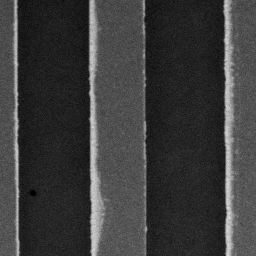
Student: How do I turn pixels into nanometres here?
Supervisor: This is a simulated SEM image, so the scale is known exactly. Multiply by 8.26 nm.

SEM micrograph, lines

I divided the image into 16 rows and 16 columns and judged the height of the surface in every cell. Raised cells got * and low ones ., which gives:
*.....***.....**
*.....***.....**
*.....***.....**
*.....***.....**
*.....***.....**
*.....***.....**
*.....***.....**
*.....***.....**
*.....***.....**
*.....***.....**
*.....***.....**
*.....***.....**
*.....***.....**
*.....***.....**
*.....***.....**
*.....***.....**